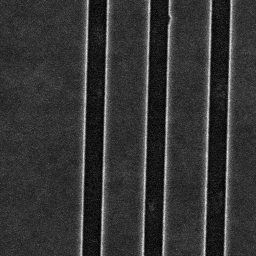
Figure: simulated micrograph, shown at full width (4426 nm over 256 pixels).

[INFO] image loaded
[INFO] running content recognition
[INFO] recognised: parallel lines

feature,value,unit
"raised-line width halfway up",732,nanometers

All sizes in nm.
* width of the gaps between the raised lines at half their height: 333